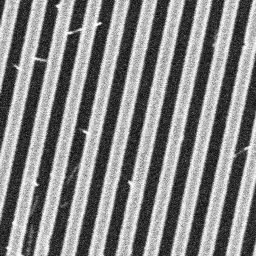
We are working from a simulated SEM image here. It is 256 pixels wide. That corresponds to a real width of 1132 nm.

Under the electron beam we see parallel lines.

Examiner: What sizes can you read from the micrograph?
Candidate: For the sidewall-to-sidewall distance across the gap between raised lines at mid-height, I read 64.3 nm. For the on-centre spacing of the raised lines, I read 0.119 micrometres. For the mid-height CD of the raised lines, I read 51.9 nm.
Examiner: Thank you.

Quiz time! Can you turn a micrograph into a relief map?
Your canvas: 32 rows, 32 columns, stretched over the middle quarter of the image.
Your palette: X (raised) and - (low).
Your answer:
---XXX---XXXX----XX----XXX----XX
--XXXX---XXX----XXX----XXX----XX
--XXX----XXX----XXX----XXX----XX
--XXX----XXX----XXX----XXX----XX
--XXX----XXX----XXX---XXX----XXX
--XXX----XX-----XX----XXX----XXX
-XXX----XXX----XXX----XXX----XXX
-XXX----XXX----XXX----XXX----XXX
-XXX----XXX----XXX----XXX---XXXX
-XXX----XXX----XXX---XXX----XXX-
-XXX---XXX----XXX----XXX----XXX-
XXX----XXX----XXX----XXX----XXX-
XXX----XXX----XXX----XXX----XXX-
XXX----XXX----XXX---XXXX---XXX--
XXX----XXX----XX----XXX----XXX--
XXX---XXX----XXX----XXX----XXX--
XX----XXX----XXX----XXX----XXX--
XX----XXX----XXX----XXX----XXX--
XX----XXX----XXX---XXXX---XXX---
XX----XX-----XX----XXX----XXX---
XX---XXX----XXX----XXX----XXX---
X----XXX----XXX----XXX----XXX---
X----XXX----XXX----XXX----XX----
X----XXX----XXX---XXX----XXX----
X----XX----XXX----XXX----XXX----
----XXX----XXX----XXX----XXX----
----XXX----XXX----XXX----XXX----
----XXX----XXX----XXX---XXX----X
----XXX---XXXX---XXX----XXX----X
---XXX----XXX----XXX----XXX----X
---XXX----XXX----XXX----XXX----X
---XXX----XXX----XXX----XXX----X